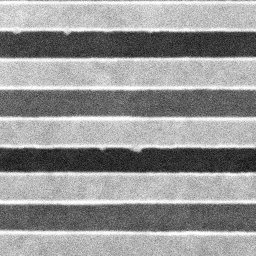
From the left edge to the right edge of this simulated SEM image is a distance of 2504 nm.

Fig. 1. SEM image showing lines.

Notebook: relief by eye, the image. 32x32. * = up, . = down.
********************************
********************************
********************************
********************************
................................
................................
................................
********************************
********************************
********************************
********************************
................................
................................
................................
................................
********************************
********************************
********************************
............*...**..............
................................
................................
................................
********************************
********************************
********************************
................................
................................
................................
................................
********************************
********************************
********************************